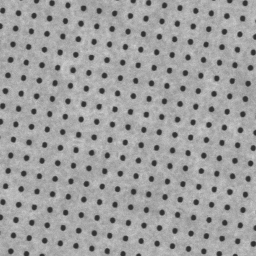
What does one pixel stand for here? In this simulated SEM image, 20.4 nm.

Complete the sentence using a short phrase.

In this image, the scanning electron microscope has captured a regular array of holes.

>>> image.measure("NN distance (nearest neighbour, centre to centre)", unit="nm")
316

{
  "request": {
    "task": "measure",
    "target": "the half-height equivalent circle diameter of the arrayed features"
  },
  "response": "117 nm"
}